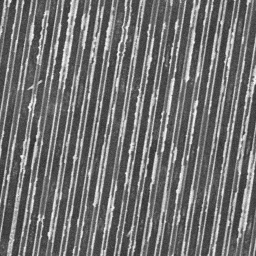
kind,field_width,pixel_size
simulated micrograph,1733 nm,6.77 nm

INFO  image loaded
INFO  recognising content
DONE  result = parallel lines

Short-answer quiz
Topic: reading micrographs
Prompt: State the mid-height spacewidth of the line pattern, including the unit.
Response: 0.0535 um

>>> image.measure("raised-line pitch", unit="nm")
90.5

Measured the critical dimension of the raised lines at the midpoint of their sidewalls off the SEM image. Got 41.8 nm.